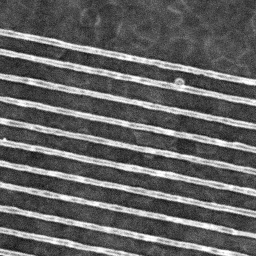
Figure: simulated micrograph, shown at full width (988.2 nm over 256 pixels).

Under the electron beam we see parallel lines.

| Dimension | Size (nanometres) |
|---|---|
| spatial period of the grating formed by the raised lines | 83.2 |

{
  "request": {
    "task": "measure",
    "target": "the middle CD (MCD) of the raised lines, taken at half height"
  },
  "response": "17 nm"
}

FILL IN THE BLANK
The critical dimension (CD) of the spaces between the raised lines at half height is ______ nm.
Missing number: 64.8